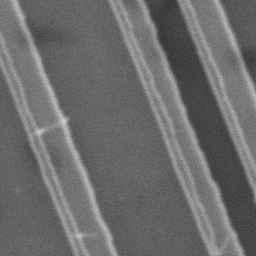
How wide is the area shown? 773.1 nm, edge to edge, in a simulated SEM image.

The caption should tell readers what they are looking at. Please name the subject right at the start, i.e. lines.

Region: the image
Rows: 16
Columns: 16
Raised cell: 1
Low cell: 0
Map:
1000000110011100
1100000111001100
1100000011001110
1100000011000110
1110000001100110
0110000001100111
0111000001100011
0111000000110011
0011000000110011
0011100000011001
0001100000011001
0001110000011000
0001110000001100
0000110000001100
0000111000000110
0000011000000110